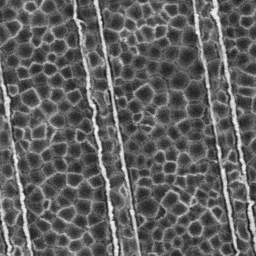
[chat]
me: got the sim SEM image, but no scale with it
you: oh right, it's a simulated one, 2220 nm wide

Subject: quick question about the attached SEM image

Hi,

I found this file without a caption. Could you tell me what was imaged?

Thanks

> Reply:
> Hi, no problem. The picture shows one or a few lines or trenches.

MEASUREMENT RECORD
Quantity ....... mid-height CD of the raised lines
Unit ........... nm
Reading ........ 201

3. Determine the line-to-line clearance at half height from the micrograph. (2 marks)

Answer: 811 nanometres